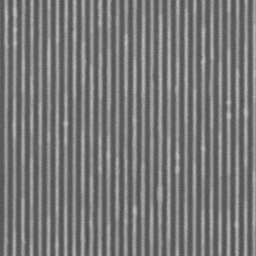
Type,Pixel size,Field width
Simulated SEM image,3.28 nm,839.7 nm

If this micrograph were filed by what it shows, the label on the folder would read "parallel lines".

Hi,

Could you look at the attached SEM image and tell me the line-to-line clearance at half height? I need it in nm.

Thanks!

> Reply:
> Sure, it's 19.7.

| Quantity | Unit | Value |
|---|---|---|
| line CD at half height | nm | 8.6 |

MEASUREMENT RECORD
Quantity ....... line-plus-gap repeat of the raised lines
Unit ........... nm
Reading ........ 28.1